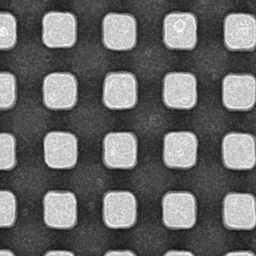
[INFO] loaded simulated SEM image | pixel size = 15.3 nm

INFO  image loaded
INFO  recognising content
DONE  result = a regular array of raised bodies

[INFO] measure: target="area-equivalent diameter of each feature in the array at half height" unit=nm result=563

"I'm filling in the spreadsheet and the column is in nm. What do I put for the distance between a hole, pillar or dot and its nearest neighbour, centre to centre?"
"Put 905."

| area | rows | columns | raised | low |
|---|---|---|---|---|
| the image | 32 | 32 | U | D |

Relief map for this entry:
DDDDDDDDDDDDDDDDDDDDDDDDDDDDDDDD
DDDDDDDDDDDDDDDDDDDDDDDDDDDDDDDD
UUDDDUUUUDDDDUUUUDDDDUUUDDDDUUUU
UUDDDUUUUDDDDUUUUDDDDUUUUDDDUUUU
UUDDDUUUUDDDDUUUUDDDDUUUUDDDUUUU
UUDDDDUUUDDDDUUUUDDDDUUUDDDDUUUU
DDDDDDDDDDDDDDDDDDDDDDDDDDDDDDDD
DDDDDDDDDDDDDDDDDDDDDDDDDDDDDDDD
DDDDDDDDDDDDDDDDDDDDDDDDDDDDDDDD
UDDDDDUUUDDDDDUUUDDDDUUUDDDDUUUD
UUDDDDUUUUDDDUUUUDDDDUUUDDDDUUUU
UUDDDUUUUUDDDUUUUDDDUUUUDDDDUUUU
UUDDDDUUUDDDDUUUUDDDUUUUDDDDUUUU
DDDDDDDUUDDDDDUUDDDDDDUUDDDDDUUD
DDDDDDDDDDDDDDDDDDDDDDDDDDDDDDDD
DDDDDDDDDDDDDDDDDDDDDDDDDDDDDDDD
DDDDDDDDDDDDDDDDDDDDDDUDDDDDDDDD
UUDDDDUUUDDDDUUUUDDDDUUUDDDDUUUU
UUDDDUUUUDDDDUUUUDDDDUUUUDDDUUUU
UUDDDDUUUDDDDUUUUDDDDUUUDDDDUUUU
UUDDDDUUUDDDDUUUUDDDDUUUDDDDUUUU
DDDDDDDDDDDDDDDDDDDDDDDDDDDDDDDD
DDDDDDDDDDDDDDDDDDDDDDDDDDDDDDDD
DDDDDDDDDDDDDDDDDDDDDDDDDDDDDDDD
UUDDDDUUUDDDDUUUUDDDDUUUDDDDUUUD
UUDDDDUUUDDDDUUUUDDDUUUUDDDDUUUU
UUDDDDUUUDDDDUUUUDDDUUUUDDDDUUUU
UUDDDDUUUDDDDUUUUDDDUUUUDDDDUUUU
DDDDDDDDDDDDDDDDDDDDDDUDDDDDDUUD
DDDDDDDDDDDDDDDDDDDDDDDDDDDDDDDD
DDDDDDDDDDDDDDDDDDDDDDDDDDDDDDDD
UDDDDDUUDDDDDDUUDDDDDUUDDDDDDUUD